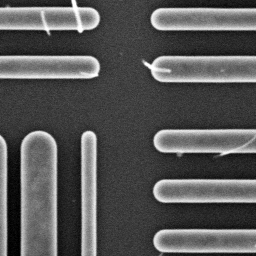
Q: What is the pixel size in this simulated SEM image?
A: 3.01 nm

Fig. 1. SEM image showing groups of lines, slits or small figures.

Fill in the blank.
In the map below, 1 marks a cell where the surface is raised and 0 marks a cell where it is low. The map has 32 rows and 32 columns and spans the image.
00000000000000000000000000000000
11111111111100000001111111111111
11111111111100000001111111111111
11111111111100000000111111111111
00000000000000000000000000000000
00000000000000000000000000000000
00000000000000000000000000000000
11111111111100000001111111111111
11111111111100000001111111111111
11111111111100000001111111111111
00000000000000000000000000000000
00000000000000000000000000000000
00000000000000000000000000000000
00000000000000000000000000000000
00000000000000000000000000000000
00000000000000000000000000000000
00000000000000000000111111111111
00011110001100000001111111111111
10011110001100000000111111111111
10011110001100000000000000000000
10011110001100000000000000000000
10011110001100000000000000000000
10011110001100000000000000000000
10011110001100000001111111111111
10011110001100000001111111111111
10011110001100000000000000000000
10011110001100000000000000000000
10011110001100000000000000000000
10011110001100000000000000000000
10011110001100000001111111111111
10011110001100000001111111111111
10011110001100000000011111111111